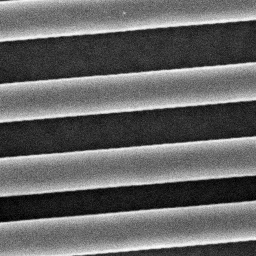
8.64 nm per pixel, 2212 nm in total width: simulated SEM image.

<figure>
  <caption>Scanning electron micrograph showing lines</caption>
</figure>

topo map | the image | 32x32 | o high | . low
oooooooooooooooooooooooooooooooo
oooooooooooooooooooooooooooooooo
ooooooooooooooooooooooooooooooo.
oooooooooooooooooooo............
oooooooo........................
................................
................................
................................
........................oooooooo
.............ooooooooooooooooooo
oooooooooooooooooooooooooooooooo
oooooooooooooooooooooooooooooooo
oooooooooooooooooooooooooooooooo
ooooooooooooooooooooo...........
oooooooo........................
................................
................................
...........................ooooo
................oooooooooooooooo
....oooooooooooooooooooooooooooo
oooooooooooooooooooooooooooooooo
oooooooooooooooooooooooooooooooo
ooooooooooooooooooooooooo.......
oooooooooooo....................
oo..............................
...........................ooooo
................oooooooooooooooo
....oooooooooooooooooooooooooooo
oooooooooooooooooooooooooooooooo
oooooooooooooooooooooooooooooooo
oooooooooooooooooooooooooo......
oooooooooooooo..................